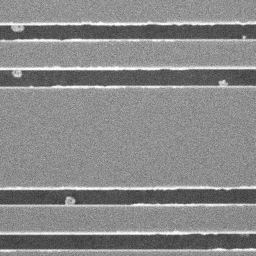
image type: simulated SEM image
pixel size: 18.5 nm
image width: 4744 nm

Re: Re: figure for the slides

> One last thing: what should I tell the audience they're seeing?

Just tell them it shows lines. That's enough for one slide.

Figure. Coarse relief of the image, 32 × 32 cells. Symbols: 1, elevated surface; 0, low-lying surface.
11111111111111111111111111111111
11111111111111111111111111111111
11111111111111111111111111111111
00000000000000000000000000000000
00000000000000000000000000000000
11111111111111111111111111111111
11111111111111111111111111111111
11111111111111111111111111111111
11111111111111111111111111111111
00000000000000000000000000000000
00000000000000000000000000000000
11111111111111111111111111111111
11111111111111111111111111111111
11111111111111111111111111111111
11111111111111111111111111111111
11111111111111111111111111111111
11111111111111111111111111111111
11111111111111111111111111111111
11111111111111111111111111111111
11111111111111111111111111111111
11111111111111111111111111111111
11111111111111111111111111111111
11111111111111111111111111111111
11111111111111111111111111111111
00000000000000000000000000000000
00000000000000000000000000000000
11111111111111111111111111111111
11111111111111111111111111111111
11111111111111111111111111111111
00000000000000000000000000000000
00000000000000000000000000000000
11111111111111111111111111111111